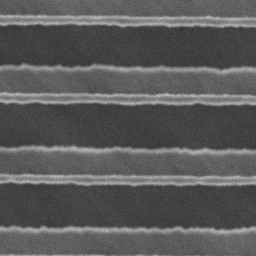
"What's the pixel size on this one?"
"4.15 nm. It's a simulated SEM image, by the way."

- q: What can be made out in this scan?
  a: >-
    lines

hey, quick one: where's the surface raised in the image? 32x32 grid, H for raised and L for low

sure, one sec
HHHHHHHHHHHHHHHHHHHHHHHHHHHHHHHH
HHHHHHHHHHHHHHHHHHHHHHHHHHHHHHHH
HHHHHHHHHHHHHHHHHHHHHHHHHHHHHHHH
LLLLLLLLLLLLLLLLLLLLLLLLLLLLLLLL
LLLLLLLLLLLLLLLLLLLLLLLLLLLLLLLL
LLLLLLLLLLLLLLLLLLLLLLLLLLLLLLLL
LLLLLLLLLLLLLLLLLLLLLLLLLLLLLLLL
LLLLLLLLLLLLLLLLLLLLLLLLLLLLLLLL
HHHHHHHHLLLHHHLLLLLLLLLLLLLLLLLL
HHHHHHHHHHHHHHHHHHHHHHHHHHHHHHHH
HHHHHHHHHHHHHHHHHHHHHHHHHHHHHHHH
HHHHHHHHHHHHHHHHHHHHHHHHHHHHHHHH
HHHHHHHHHHHHHHHHHHHHHHHHHHHHHHHH
LLLLLLLLLLLLLLLLLLLLLLLLLLLLLLLL
LLLLLLLLLLLLLLLLLLLLLLLLLLLLLLLL
LLLLLLLLLLLLLLLLLLLLLLLLLLLLLLLL
LLLLLLLLLLLLLLLLLLLLLLLLLLLLLLLL
LLLLLLLLLLLLLLLLLLLLLLLLLLLLLLLL
LLLHHLLLLLLLLLLLLLLLLLLLLLLLLLLL
HHHHHHHHHHHHHHHHHHHHHHHHHHHHHHHH
HHHHHHHHHHHHHHHHHHHHHHHHHHHHHHHH
HHHHHHHHHHHHHHHHHHHHHHHHHHHHHHHH
HHHHHHHHHHHHHHHHHHHHHHHHHHHHHHHH
LLLLLLLLLLLLLLLLLLLLLLLLLLLLLLLL
LLLLLLLLLLLLLLLLLLLLLLLLLLLLLLLL
LLLLLLLLLLLLLLLLLLLLLLLLLLLLLLLL
LLLLLLLLLLLLLLLLLLLLLLLLLLLLLLLL
LLLLLLLLLLLLLLLLLLLLLLLLLLLLLLLL
LLLLLLLLLLLLLLLLLLLLLLLLLLLLLLLL
HHHHHHHHHHHHHHHHHHHHHHHHHHHHHHHH
HHHHHHHHHHHHHHHHHHHHHHHHHHHHHHHH
HHHHHHHHHHHHHHHHHHHHHHHHHHHHHHHH